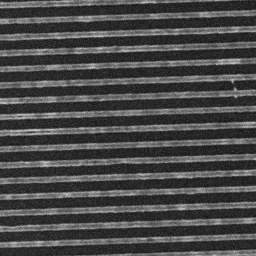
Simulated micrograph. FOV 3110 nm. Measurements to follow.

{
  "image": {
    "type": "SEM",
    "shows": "parallel lines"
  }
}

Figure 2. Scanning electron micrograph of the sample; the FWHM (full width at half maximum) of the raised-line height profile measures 5.24 px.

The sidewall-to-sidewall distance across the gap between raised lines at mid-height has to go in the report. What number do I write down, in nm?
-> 134